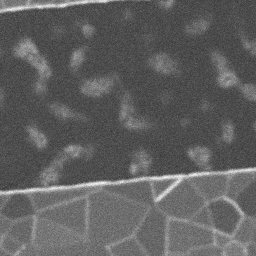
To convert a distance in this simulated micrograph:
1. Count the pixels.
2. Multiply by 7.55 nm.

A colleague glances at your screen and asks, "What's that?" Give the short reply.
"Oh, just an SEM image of one or a few lines or trenches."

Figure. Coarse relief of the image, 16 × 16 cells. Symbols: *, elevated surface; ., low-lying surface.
**..............
................
................
................
................
................
................
................
................
................
................
......**********
****************
****************
****************
****************